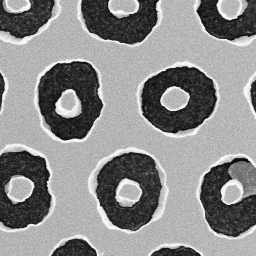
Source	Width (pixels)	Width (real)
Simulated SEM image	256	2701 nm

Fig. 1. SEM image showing ring-shaped grooves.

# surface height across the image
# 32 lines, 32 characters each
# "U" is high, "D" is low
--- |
DUUUDDDUUUDDDDUUUDDDUUUUUDDUUUDD
DDDDDDDUUUDDDDUUUDDDUUUUUDDUUUDD
DDDDDDUUUUDDDDDDDDDDUUUUUDDDDDDD
DDDDDUUUUUUDDDDDDDDUUUUUUUDDDDDD
UDDDUUUUUUUUDDDDDDUUUUUUUUUDDDDD
UUUUUUUUUUUUUUUUDUUUUUUUUUUUUUUU
UUUUUUUUUUUUUUUUUUUUUUUUUUUUUUUU
UUUUUUUUUUUUUUUUUUUUUUUUUUUUUUUU
UUUUUUDDDDDDUUUUUUUUUDDDUUUUUUUU
UUUUUDDDDDDDUUUUUUUDDDDDDDUUUUUU
DUUUUDDDDDDDUUUUUUDDDDDDDDDUUUUD
UUUUUDDDUDDDUUUUUUDDDUUDDDDUUUUD
UUUUUDDUUUDDDUUUUUDDUUUUDDDUUUUD
UUUUUDDUUUDDDUUUUUDDDUUDDDDUUUUU
UUUUUDDDUDDDUUUUUUDDDDDDDDUUUUUU
UUUUUDDDDDDDUUUUUUUDDDDDDUUUUUUU
UUUUUUDDDDDUUUUUUUUUUDDDUUUUUUUU
UUUUUUUUDUUUUUUUUUUUUUUUUUUUUUUU
UUDUUUUUUUUUUUUUUUUUUUUUUUUUUUUU
DDDDDUUUUUUUUUDDDDDUUUUUUUUUUUUU
DDDDDDUUUUUUUDDDDDDDUUUUUUUDDDDD
DDDDDDUUUUUUDDDDDDDDUUUUUUDDDDDD
DUUUDDUUUUUUDDDUDDDDDUUUUDDDDDDD
DUUUDDUUUUUUDDDUUUDDDUUUUDDDUUDD
DUUUDDUUUUUUDDDUUUDDDUUUUDDDUUDD
DDDDDDUUUUUUUDDDDDDDUUUUUDDDUDDD
DDDDDDUUUUUUUDDDDDDDUUUUUUDDDDDD
DDDDDUUUUUUUUUDDDDDUUUUUUUDDDDDD
UDDUUUUUUUUUUUUDDDUUUUUUUUDDDDDD
UUUUUUUUUUUUUUUUUUUUUUUUUUUUDDUU
UUUUUUUDDDDUUUUUUUUUUUUUUUUUUUUU
UUUUUUUDDDDDUUUUUUUDDDDDDUUUUUUU